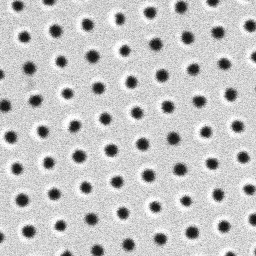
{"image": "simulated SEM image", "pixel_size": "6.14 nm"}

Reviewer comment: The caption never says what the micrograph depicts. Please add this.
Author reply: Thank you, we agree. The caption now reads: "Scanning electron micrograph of a regular array of holes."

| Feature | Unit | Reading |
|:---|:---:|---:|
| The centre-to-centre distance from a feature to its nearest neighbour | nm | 195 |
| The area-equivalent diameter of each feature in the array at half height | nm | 76.4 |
